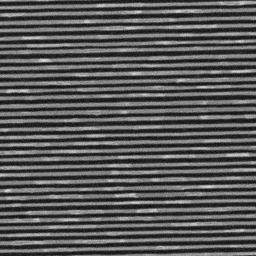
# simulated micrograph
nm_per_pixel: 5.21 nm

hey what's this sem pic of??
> parallel lines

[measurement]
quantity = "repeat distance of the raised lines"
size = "39.6 nanometres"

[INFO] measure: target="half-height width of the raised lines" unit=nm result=18.2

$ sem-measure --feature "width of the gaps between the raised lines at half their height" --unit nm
22.8